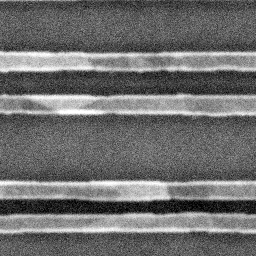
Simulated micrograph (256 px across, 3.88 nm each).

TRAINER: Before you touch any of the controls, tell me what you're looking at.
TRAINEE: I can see lines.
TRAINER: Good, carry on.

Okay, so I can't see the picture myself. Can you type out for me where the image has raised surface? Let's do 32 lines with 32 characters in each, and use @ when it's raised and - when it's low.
--------------------------------
--------------------------------
--------------------------------
--------------------------------
--------------------------------
--------------------------------
--------------------------------
@@@@@@@@@@@@@@@@@@@@@@@@@@@@@@@@
@@@@@@@@@@@@@@@@@@@@@@@@@@@@@@@@
--------------------------------
--------------------------------
--------------------------------
@@@@@@@@@@@@@@@@@@@@@@@@@@@@@@@@
@@@@@@@@@@@@@@@@@@@@@@@@@@@@@@@@
--------------------------------
--------------------------------
--------------------------------
--------------------------------
--------------------------------
--------------------------------
--------------------------------
--------------------------------
--------------------------------
@@@@@@@@@@@@@@@@@@@@@@@@@@@@@@@@
@@@@@@@@@@@@@@@@@@@@@@@@@@@@@@@@
--------------------------------
--------------------------------
@@@@@@@@@@@@@@@@@@@@@@@@@@@@@@@@
@@@@@@@@@@@@@@@@@@@@@@@@@@@@@@@@
--------------------------------
--------------------------------
--------------------------------